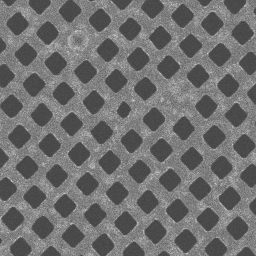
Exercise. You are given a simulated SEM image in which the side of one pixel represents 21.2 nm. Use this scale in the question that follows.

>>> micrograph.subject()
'a regular array of holes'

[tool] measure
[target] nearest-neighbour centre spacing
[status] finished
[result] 650 nm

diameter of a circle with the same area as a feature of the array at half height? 443 nm